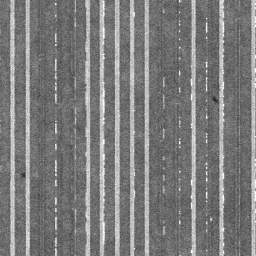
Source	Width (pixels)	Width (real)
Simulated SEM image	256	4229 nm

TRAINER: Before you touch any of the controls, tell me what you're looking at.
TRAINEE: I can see parallel lines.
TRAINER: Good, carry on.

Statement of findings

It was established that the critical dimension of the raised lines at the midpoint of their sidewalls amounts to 59.9 nanometers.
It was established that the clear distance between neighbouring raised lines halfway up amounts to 192 nm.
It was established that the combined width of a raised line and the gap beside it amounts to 249 nm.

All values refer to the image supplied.